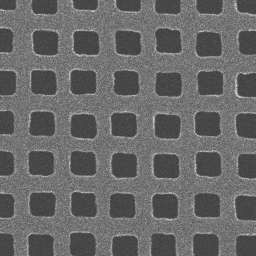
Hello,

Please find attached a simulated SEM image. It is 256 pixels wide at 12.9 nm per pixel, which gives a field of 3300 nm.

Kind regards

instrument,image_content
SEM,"a regular array of holes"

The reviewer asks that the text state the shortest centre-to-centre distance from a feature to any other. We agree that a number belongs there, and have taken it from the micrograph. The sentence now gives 510 nanometres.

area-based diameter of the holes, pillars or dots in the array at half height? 353 nm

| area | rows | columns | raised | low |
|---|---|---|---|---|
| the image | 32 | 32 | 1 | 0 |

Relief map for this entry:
00110001100011000010000110001100
11110001111111111111001110001100
11111111111111111111111111111111
01111111111111111111011111111111
00110001100011000010000110011100
00110001100011000010000100001100
01110001100011100011001110001100
11111111111111111111111111111111
11111111111111111111111111111111
00110001100011000111000110001100
00110001100011000110000110001100
00110001100011000111000110001100
11111111111111111111111111111111
11111111111111111111111111111111
00110001100011000111001100011100
00110001100011000110000100001000
00110001100011000110001100001100
11111111111111111111111111111111
11111111111111111111111111111111
00110001100011000110001110011100
00110001100011000110001100001100
00110001100011000110001110001100
11111111111111111111111111111111
11111111111111111111111111111111
01110001100011000110001100011100
00110001100011000110001100011000
00110001100011000110001100001000
11111111111111111111111111111110
11111111111111111111111111111111
01110011100011101110001100011100
00110001100011000110001100011000
00110001100011000110001100011000